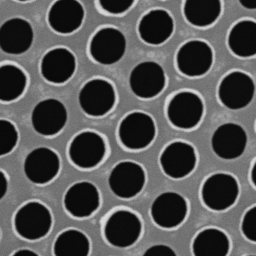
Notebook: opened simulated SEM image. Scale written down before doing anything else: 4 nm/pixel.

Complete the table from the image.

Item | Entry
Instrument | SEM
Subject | a regular array of holes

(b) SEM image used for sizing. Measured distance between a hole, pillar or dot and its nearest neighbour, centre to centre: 199 nm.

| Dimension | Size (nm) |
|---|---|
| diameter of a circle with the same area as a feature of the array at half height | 142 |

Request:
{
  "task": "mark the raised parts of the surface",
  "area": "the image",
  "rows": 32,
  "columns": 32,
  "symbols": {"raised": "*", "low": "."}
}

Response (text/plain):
*******...***...*******....***..
******....****.****..**....*****
*..***....********....**...*****
....***...*******.....*******...
....********...***...********...
....*******.....***.***...***...
*..***...**....*******....***...
*****....***...*******....******
..***....********...**....******
...**....*******.....*******...*
...********...**.....*******....
...*******....***...*******.....
.*****.***....********...***...*
****....**....*******....****.**
****....********...**....*******
.***....*******....***...***.***
..***..********....********....*
..*******....**....********....*
..*******....***..***...***....*
***....**....*******....***...**
***....***..***..***....********
***....*******....***...********
.***..********....********...***
.********...**....*******.....**
********....***..***...**.....**
***..***....*******....***...***
**....***...***.***....********.
**....********...**....*******..
**....*******.....************..
***..**....**....********...***.
*******....***..********.....***
**..***....*******....**....****